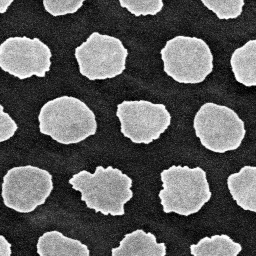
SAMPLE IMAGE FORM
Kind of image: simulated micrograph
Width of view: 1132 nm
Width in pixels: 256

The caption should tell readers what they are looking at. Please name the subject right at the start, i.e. a regular array of raised bodies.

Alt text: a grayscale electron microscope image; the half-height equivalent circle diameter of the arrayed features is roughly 0.215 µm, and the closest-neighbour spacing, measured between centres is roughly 325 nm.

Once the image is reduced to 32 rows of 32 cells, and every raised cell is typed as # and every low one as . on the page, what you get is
#....#####.....#####......####..
......###.......####.......###..
................................
................................
...........###..................
#####.....#####......#####.....#
######....######....######...###
######....######....######...###
######....#####......#####...###
..#........###.......#####...###
...............................#
................................
.......###......................
.....######....######....###....
#....#######...######...######..
##...#######...######...######..
##...#######...#####.....#####..
#......###.......##......#####..
..........................####..
................................
................................
.#####......###.....#####.....##
######...#######....######...###
######...#######....######...###
######....######....######...###
.####......#####....#####.....##
.............##.......##........
................................
................................
.....###........###........#....
#....#####.....#####.....#####..
#....######...#######...######..